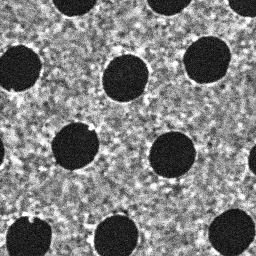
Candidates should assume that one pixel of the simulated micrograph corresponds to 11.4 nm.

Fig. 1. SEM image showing holes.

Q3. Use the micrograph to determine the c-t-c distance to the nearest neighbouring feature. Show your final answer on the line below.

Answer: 84.1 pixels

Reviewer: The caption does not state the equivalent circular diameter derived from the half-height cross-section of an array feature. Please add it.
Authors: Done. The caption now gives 554 nanometers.